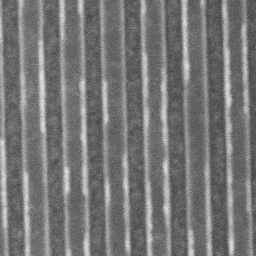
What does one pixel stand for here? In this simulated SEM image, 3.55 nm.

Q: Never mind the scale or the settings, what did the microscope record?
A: parallel lines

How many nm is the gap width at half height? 64.8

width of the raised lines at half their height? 80.8 nm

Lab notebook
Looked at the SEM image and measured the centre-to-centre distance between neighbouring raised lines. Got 145 nanometres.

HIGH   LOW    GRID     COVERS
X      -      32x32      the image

--XXX--XXX---XX---XX---XXX--XXX-
--XXX---XX---XX---XXX--XXX--XXX-
--XXX---XX---XX---XXX--XXX--XXX-
---XX---XX---XX---XXX--XXX--XXX-
--XXX---XX---XX---XX---XXX--XXX-
---XX---XX---XX---XXX--XXX--XXX-
---XX---XX---XXX--XXX--XXX--XXX-
---XX---XX---XXX--XXX--XXX--XXX-
---XX---XX---XXX--XXX--XXX--XXX-
---XX---XX---XXX--XXX--XXX--XXX-
---XX---XXX--XXX--XXX--XXX--XXX-
---XXX--XXX--XXX--XXX--XXX--XXX-
---XXX--XXX--XXX--XXX--XXX--XXX-
---XX---XXX--XXX--XXX--XXX--XXX-
---XX---XXX--XXX--XXX--XXX--XXX-
---XXX--XXX--XXX--XXX--XXX--XXX-
X--XXX--XXX--XXX--XXX--XXX--XXX-
X--XXX--XXX--XXX--XXX--XXX--XXX-
X--XXX--XXX--XXX--XXX--XXX--XXX-
X--XXX--XXX--XXX--XXX--XXX--XXX-
X--XXX--XXX--XXX--XXX--XXX--XXX-
X--XXX--XXX--XXX--XXX--XXX--XXX-
X--XXX--XXX--XXX--XXX--XXX--XXX-
X--XXX--XXX--XXX--XXX--XXX--XXX-
X--XXX--XXX--XXX--XXX--XXX---XX-
X--XXX--XXX--XXX--XXX---XX---XX-
X--XXX--XXX--XXX--XXX--XXX---XX-
X--XXX--XXX--XXX--XXX--XXX---XX-
X--XXX--XXX--XXX--XXX---XX---XX-
X--XXX--XXX--XXX---XX---XX---XX-
X--XXX--XXX--XXX---XX---XX---XX-
X--XXX--XXX--XXX---XX---XX---XX-